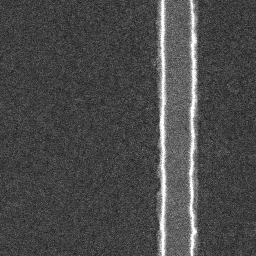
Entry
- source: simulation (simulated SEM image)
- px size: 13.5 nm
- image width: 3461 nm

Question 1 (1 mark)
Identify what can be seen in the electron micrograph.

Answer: one or a few lines or trenches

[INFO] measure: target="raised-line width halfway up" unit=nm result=404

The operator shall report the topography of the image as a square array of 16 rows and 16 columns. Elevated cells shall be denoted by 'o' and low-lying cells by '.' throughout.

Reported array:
..........oo....
..........oo....
..........oo....
..........oo....
..........oo....
..........oo....
..........oo....
..........oo....
..........oo....
..........oo....
..........oo....
..........oo....
..........oo....
..........oo....
..........oo....
..........oo....